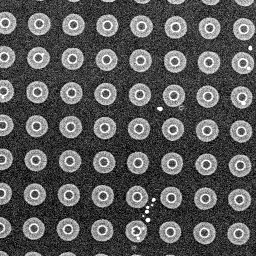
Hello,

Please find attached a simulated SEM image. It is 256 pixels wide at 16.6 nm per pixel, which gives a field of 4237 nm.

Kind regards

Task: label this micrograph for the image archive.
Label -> an array of small figures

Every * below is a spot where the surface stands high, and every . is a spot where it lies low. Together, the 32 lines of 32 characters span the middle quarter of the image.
****.....****....****....*****..
..........**......***.....****..
................................
................................
................................
****.....***.....****.....***...
****....*****...*****....*****..
****....*****...******...*****..
****....*****...******...*****..
***......***.....****....*****..
..........................**....
................................
................................
***......**.....................
****....*****....****....****...
****....*****...*****....*****..
****...******...*****....*****..
****....*****...*****....*****..
.........**......***......***...
................................
................................
................................
***.....****.....***......**....
****....****....*****....****...
****...******...*****...******..
****...******...*****...******..
***.....****....*****....****...
................................
................................
................................
***......**.....................
****...*****....****.....****...